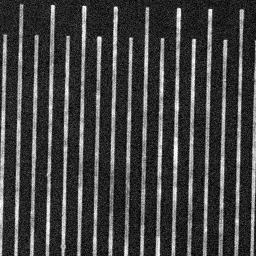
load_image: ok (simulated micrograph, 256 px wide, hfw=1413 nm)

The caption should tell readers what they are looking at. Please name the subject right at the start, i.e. parallel lines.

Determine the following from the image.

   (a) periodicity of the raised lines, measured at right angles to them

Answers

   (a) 0.0868 um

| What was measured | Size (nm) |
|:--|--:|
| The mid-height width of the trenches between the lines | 71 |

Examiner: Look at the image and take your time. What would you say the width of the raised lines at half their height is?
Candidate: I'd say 0.0159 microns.